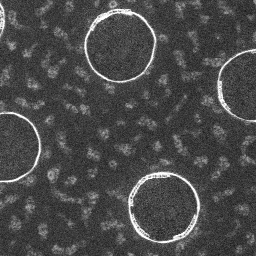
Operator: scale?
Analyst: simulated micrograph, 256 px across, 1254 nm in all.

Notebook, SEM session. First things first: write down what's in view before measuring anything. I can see raised bodies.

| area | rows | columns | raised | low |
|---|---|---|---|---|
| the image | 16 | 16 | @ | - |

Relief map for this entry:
----------------
------@@@-------
-----@@@@@------
-----@@@@@-----@
------@@@-----@@
--------------@@
--------------@@
@@-------------@
@@--------------
@@--------------
@@--------------
---------@@@----
--------@@@@----
--------@@@@----
---------@@@----
----------------